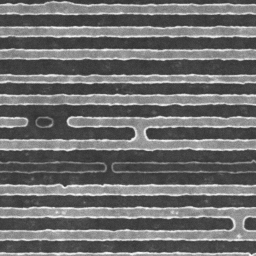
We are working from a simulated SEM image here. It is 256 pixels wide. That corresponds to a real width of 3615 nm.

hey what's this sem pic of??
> parallel lines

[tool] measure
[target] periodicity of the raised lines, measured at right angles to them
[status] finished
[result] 0.319 um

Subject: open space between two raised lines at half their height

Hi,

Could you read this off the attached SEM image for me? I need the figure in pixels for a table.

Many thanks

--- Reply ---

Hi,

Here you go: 13.3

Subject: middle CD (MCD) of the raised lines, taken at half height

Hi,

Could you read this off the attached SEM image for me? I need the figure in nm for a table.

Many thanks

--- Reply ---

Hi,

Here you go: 134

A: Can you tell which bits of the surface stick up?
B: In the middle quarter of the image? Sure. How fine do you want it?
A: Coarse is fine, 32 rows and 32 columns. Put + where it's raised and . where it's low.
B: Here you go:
................................
................................
................................
++++++++++++++++++++++++++++++++
+++.++++++.+++.+.++++++.+..++..+
................................
................................
................................
++++++++++++++++++++++++++++++++
++++++++++++++++++++++++++++++++
................................
................................
................................
.++++..................++.++...+
.+++++++++++++++++++++++++++++++
..++++++++++++++++++++++++++++++
..................++............
..................++............
..................+++...........
++++++++++++++++++++++++++++++++
++++++++++++++++++++++++++++++++
++..................+++.........
................................
................................
++..............................
++++++++++..++++++++++++++++++++
++++++++++..++++++++++++++++++++
................................
................................
................................
.+++.+++++++++++++++++++++++++++
++++++++++++++++++++++++++++++++